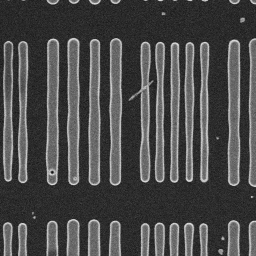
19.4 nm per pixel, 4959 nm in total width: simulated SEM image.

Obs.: groups of lines, slits or small figures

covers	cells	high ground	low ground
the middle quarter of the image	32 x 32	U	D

DUUUDDDUUDDDUUDDDDDUUDDUUDDUUDDU
DUUUDDDUUDDDUUDDDDDUUDDUUDDUUDDU
DUUDDDDUUDDDUUDDDDDUUDDUUDDUUDDU
DUUUDDDUUDDDUUDDDDDUUDDUUDDUUDUU
DUUUDDDUUDDDUUDDDDDUUUDUUDDUUDUU
DUUUDDUUUDDDUUDDDDDUUDDUUDDUUDUU
DUUUDDUUUDDDUUDDDDDUUDDUUDDUUDUU
DUUUDDUUUDDDUUDDDDDUUDDUUDDUUDUU
DUUUDDUUUDDDUUDDDDDUUDDUUDDUUDUU
DUUUDDUUUDDDUUDDDDDUUDDUUDDUUDUU
DUUUDDUUUDDDUUDDDDDUUDDUUDDUUDDU
DUUUDDUUUDDDUUDDDDDUUDDUUDDUUDDU
DUUUDDUUUDDDUUDDDDDUUDDUUDDUUDDU
DUUUDDUUUDDDUUDDDDDUUDDUUDDUUDDU
DUUUDDUUUDDDUUDDDDDUUDDUUDDUUDDU
DUUUDDUUUDDDUUDDDDDUUDDUUDDUUDDU
DUUUDDUUUDDDUUDDDDDUUDDUUDDUUDDU
DUUUDDUUUDDDUUDDDDDDUDDUUDDUUDDU
DUUUDDUUUDDDUUDDDDDDUDDUUDDUUDDU
DUUUDDUUUDDDUUDDDDDUUDDUUDDUUDDU
DUUUDDUUUDDDUUDDDDDUUDDUUDDUDDDU
DUUDDDUUUDDDUUDDDDDUUDDUUDDUDDDU
DUUUDDUUUDDDUUDDDDDUUDDUUDDUDDDU
DUUUDDUUUDDDUUDDDDDUUDDUUDDUDDDU
DUUUDDUUUDDDUUDDDDDUUDDUUDDUDDDU
DUUUDDUUUDDDUUDDDDDUUDDUUDDUDDDU
DUUUDDUUUDDDUUDDDDDUUDDUUDDUDDDU
DUUUDDUUUDDDUUDDDDDUUDDUUDDUDDDU
DUUUDDUUUDDDUUDDDDDUUDDUUDDUUDDU
DUUUDDUUUDDDUUDDDDDDDDDDDDDDDDDD
DDDDDDDDDDDDDDDDDDDDDDDDDDDDDDDD
DDDDDDDDDDDDDDDDDDDDDDDDDDDDDDDD